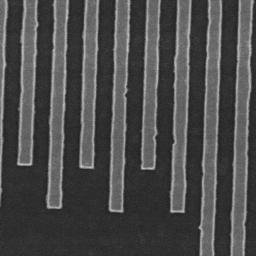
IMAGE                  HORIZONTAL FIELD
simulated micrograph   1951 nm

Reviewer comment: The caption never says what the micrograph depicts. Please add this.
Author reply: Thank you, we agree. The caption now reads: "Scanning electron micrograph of parallel lines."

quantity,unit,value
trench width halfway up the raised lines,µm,0.143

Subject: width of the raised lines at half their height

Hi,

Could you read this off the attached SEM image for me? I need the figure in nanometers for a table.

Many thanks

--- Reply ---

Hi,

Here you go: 92.3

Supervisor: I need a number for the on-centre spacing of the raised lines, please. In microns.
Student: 0.234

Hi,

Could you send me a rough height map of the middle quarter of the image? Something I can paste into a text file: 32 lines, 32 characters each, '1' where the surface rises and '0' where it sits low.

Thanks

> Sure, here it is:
00000111000001110000111000001110
00000111000001110000111100001110
00000111000001110000111100001110
00000111000001110000111000001110
00000111000001100000111000001110
00000111000001100000111000001110
00000111000001100000111000001110
00000111000001100000111000001110
00000111000001100000111000001110
00000111000001100000111000001110
00000111000011100000111000001110
00000111000011100000111000001110
00001111000011100000111000001110
00001110000011100000111000001110
00000110000011100000111000001110
00000110000011100000111000001110
00000110000011100000111000001110
00000110000011100000111000001100
00000110000011100000111000001100
00001110000011100000111000001100
00001110000011100000111000011100
00001110000011100000111000011100
00001110000011100000111000011100
00001110000011100000111000011100
00001110000011100000111000011100
00001110000011100001111000011100
00000000000011100000000000011100
00000000000011100000000000011100
00000000000011100000000000011100
00000000000011100000000000011100
00000000000011100000000000011100
00000000000011100000000000011100